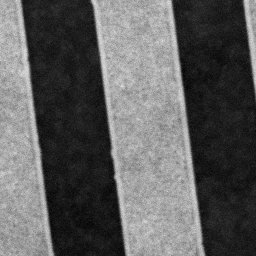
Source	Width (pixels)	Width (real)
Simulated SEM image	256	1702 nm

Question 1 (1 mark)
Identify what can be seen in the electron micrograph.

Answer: one or a few lines or trenches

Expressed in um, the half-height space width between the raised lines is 0.508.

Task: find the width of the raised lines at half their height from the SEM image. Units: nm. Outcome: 484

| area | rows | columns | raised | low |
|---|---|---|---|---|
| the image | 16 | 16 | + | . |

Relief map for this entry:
+.....+++++....+
+.....+++++.....
+.....+++++.....
++....+++++.....
++.....++++.....
++.....++++.....
++.....++++.....
++.....+++++....
++.....+++++....
++.....+++++....
++.....+++++....
+++....+++++....
+++.....++++....
+++.....++++....
+++.....++++....
+++.....+++++...